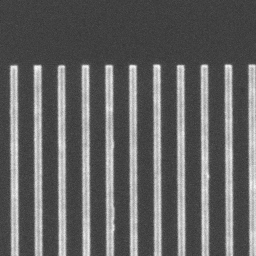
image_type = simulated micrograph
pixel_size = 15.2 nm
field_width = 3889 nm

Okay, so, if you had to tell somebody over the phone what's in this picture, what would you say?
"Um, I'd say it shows parallel lines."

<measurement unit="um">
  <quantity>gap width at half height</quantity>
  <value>0.272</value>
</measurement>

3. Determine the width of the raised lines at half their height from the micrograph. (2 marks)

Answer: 96.8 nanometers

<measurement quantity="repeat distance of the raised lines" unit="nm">362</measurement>